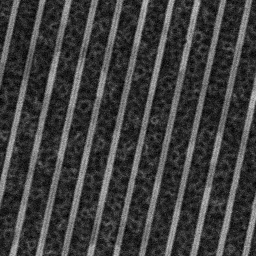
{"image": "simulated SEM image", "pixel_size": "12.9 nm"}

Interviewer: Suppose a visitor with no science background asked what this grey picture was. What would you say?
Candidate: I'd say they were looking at parallel lines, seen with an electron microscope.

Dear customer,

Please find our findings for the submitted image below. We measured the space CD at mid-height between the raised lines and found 280 nanometers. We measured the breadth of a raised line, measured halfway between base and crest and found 48.8 nanometres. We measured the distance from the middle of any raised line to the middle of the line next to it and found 325 nm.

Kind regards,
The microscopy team